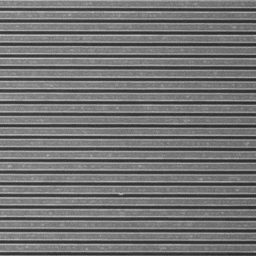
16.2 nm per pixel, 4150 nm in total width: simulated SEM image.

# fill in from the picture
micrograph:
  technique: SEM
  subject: parallel lines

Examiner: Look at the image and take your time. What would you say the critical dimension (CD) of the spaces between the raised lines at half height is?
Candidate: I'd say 0.0568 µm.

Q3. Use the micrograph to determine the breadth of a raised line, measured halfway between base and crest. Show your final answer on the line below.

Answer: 126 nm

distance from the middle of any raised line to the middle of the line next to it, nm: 188